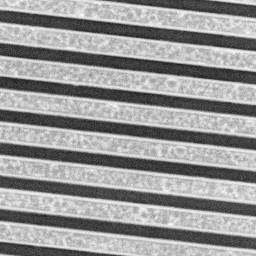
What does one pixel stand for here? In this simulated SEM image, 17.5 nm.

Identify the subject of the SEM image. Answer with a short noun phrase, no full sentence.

parallel lines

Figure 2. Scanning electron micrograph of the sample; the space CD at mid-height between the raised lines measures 13.8 pixels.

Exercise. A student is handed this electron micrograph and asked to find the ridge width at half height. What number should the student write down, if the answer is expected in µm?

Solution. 0.322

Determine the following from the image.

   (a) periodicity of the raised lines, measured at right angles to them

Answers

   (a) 0.576 um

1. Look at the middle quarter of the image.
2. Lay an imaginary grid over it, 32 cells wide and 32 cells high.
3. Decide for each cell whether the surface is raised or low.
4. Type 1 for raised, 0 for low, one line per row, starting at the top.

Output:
11111000000000000000000000000000
11111111111111000000000000000000
11111111111111111111110000000000
11111111111111111111111111111110
11111111111111111111111111111111
00000000001111111111111111111111
00000000000000001111111111111111
00000000000000000000000000011111
11000000000000000000000000000000
11111111111000000000000000000000
11111111111111111111000000000000
11111111111111111111111111111000
11111111111111111111111111111111
00000001111111111111111111111111
00000000000000001111111111111111
00000000000000000000000001111111
00000000000000000000000000000000
11111111000000000000000000000000
11111111111111111000000000000000
11111111111111111111111111000000
11111111111111111111111111111111
00001111111111111111111111111111
00000000000001111111111111111111
00000000000000000000001111111111
00000000000000000000000000000001
11111000000000000000000000000000
11111111111111000000000000000000
11111111111111111111111000000000
11111111111111111111111111111111
01111111111111111111111111111111
00000000001111111111111111111111
00000000000000000001111111111111